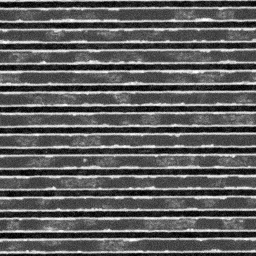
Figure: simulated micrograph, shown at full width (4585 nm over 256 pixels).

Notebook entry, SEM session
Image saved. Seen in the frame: parallel lines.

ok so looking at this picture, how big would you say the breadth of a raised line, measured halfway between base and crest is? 248 nm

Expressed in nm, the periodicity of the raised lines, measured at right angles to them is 376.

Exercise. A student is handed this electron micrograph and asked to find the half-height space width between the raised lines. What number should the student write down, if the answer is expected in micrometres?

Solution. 0.141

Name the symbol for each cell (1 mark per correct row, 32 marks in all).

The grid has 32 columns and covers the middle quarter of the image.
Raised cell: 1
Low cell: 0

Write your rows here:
00000000000000000000000000000000
00000000000000000000000000000000
11111111111111111111111111111111
11111111111111111111111111111111
11111111111111111111111111111111
00000000000000000000000000000000
00000000000000000000000000000000
11111111111111111111111111111111
11111111111111111111111111111111
11111111111111111111111111111111
00000000000000000000000000000000
00000000000000000000000000000000
11111111111111111111111111111111
11111111111111111111111111111111
11111111111111111111111111111111
00001100010011000000001100000001
00000000000000000000000000000000
00000000000000000000000000000000
11111111111111111111111111111111
11111111111111111111111111111111
11111111111111111111111111111111
00000000000000000000000000000000
00000000000000000000000000000000
11111111111111111111111111111111
11111111111111111111111111111111
11111111111111111111111111111111
00000000000000000000000000000000
00000000000000000000000000000000
11111111111111111111111111111111
11111111111111111111111111111111
11111111111111111111111111111111
00000000000000000000000000000000